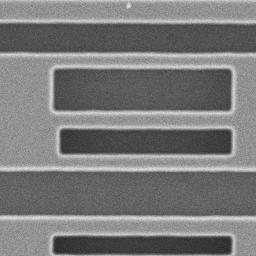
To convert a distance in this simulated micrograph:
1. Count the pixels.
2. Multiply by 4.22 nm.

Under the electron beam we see groups of lines, slits or small figures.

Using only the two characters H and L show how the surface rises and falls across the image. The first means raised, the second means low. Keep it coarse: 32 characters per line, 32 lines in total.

HHHHHHHHHHHHHHHHHHHHHHHHHHHHHHHH
HHHHHHHHHHHHHHHHHHHHHHHHHHHHHHHH
HHHHHHHHHHHHHHHHHHHHHHHHHHHHHHHH
LLLLLLLLLLLLLLLLLLLLLLLLLLLLLLLL
LLLLLLLLLLLLLLLLLLLLLLLLLLLLLLLL
LLLLLLLLLLLLLLLLLLLLLLLLLLLLLLLL
LLLLLLLLLLLLLLLLLLLLLLLLLLLLLLLL
HHHHHHHHHHHHHHHHHHHHHHHHHHHHHHHH
HHHHHHHLLLLLLLLLHHLLLHHHHHHHHHHH
HHHHHHHLLLLLLLLLLLLLLLLLLLLLLHHH
HHHHHHHLLLLLLLLLLLLLLLLLLLLLLHHH
HHHHHHHLLLLLLLLLLLLLLLLLLLLLLHHH
HHHHHHHLLLLLLLLLLLLLLLLLLLLLLHHH
HHHHHHHLLLLLLLLLLLLLLLLLLLLLLHHH
HHHHHHHHHHHHHHHHHHHHHHHHHHHHHHHH
HHHHHHHHHHHHHHHHHHHHHHHHHHHHHHHH
HHHHHHHHLLLLLLLLLLLLLLLLLLLLLHHH
HHHHHHHLLLLLLLLLLLLLLLLLLLLLLHHH
HHHHHHHLLLLLLLLLLLLLLLLLLLLLLHHH
HHHHHHHHHHHHHHHHHHHHHHHHHHHHHHHH
HHHHHHHHHHHHHHHHHHHHHHHHHHHHHHHH
LLLLLLLLLLLLLLLLLLLLLLLLLLLLLLLL
LLLLLLLLLLLLLLLLLLLLLLLLLLLLLLLL
LLLLLLLLLLLLLLLLLLLLLLLLLLLLLLLL
LLLLLLLLLLLLLLLLLLLLLLLLLLLLLLLL
LLLLLLLLLLLLLLLLLLLLLLLLLLLLLLLL
LLLLLLLLLLLLLLLLLLLLLLLLLLLLLLLL
HHHHHHHHHHHHHHHHHHHHHHHHHHHHHHHH
HHHHHHHHHHHHHHHHHHHHHHHHHHHHHHHH
HHHHHHHLLLLLLLLLLLLLLLLLLLLLHHHH
HHHHHHHLLLLLLLLLLLLLLLLLLLLLLHHH
HHHHHHHLLLLLLLLLLLLLLLLLLLLLLHHH